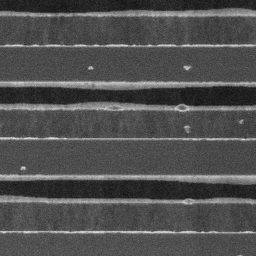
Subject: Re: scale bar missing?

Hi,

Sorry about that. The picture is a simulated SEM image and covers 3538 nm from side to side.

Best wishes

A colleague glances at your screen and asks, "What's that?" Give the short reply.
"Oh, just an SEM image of lines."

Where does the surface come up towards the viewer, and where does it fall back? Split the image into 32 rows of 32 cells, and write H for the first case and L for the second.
LLLLLLLLLLLLLLLLLLLLLLLLLLLLLLLL
LLLLLLLLLLLLLLLLLLLLLLLLLLLLLLLL
HHHHHHHHHHHHHHHHHHHHHHHHHHHHHHHH
HHHHHHHHHHHHHHHHHHHHHHHHHHHHHHHH
HHHHHHHHHHHHHHHHHHHHHHHHHHHHHHHH
HHHHHHHHHHHHHHHHHHHHHHHHHHHHHHHH
HHHHHHHHHHHHHHHHHHHHHHHHHHHHHHHH
HHHHHHHHHHHHHHHHHHHHHHHHHHHHHHHH
HHHHHHHHHHHHHHHHHHHHHHHHHHHHHHHH
HHHHHHHHHHHHHHHHHHHHHHHHHHHHHHHH
LLLLLLLLLLLLLHHHHHLLLLLLLLLLLLLL
LLLLLLLLLLLLLLLLLLLLLLLLLLLLLLLL
LLLLLLLLLLLLLLLLLLLLLLLLLLLLLLLL
LLLLLLLLLLLLLHHHLLLLLLHHLLLLLLLL
HHHHHHHHHHHHHHHHHHHHHHHHHHHHHHHH
HHHHHHHHHHHHHHHHHHHHHHHHHHHHHHHH
HHHHHHHHHHHHHHHHHHHHHHHHHHHHHHHH
HHHHHHHHHHHHHHHHHHHHHHHHHHHHHHHH
HHHHHHHHHHHHHHHHHHHHHHHHHHHHHHHH
HHHHHHHHHHHHHHHHHHHHHHHHHHHHHHHH
HHHHHHHHHHHHHHHHHHHHHHHHHHHHHHHH
HHHHHHHHHHHHHHHHHHHHHHHHHHHHHHHH
LLLLLLLLLLLLLLLLLLLLLLLLLLLLLLLL
LLLLLLLLLLLLLLLLLLLLLLLLLLLLLLLL
LLLLLLLLLLLLLLLLLLLLLLLLLLLLLLLL
HHHHHHHHHHHHHHHHHHHHHHHHHHHHHHHH
HHHHHHHHHHHHHHHHHHHHHHHHHHHHHHHH
HHHHHHHHHHHHHHHHHHHHHHHHHHHHHHHH
HHHHHHHHHHHHHHHHHHHHHHHHHHHHHHHH
HHHHHHHHHHHHHHHHHHHHHHHHHHHHHHHH
HHHHHHHHHHHHHHHHHHHHHHHHHHHHHHHH
HHHHHHHHHHHHHHHHHHHHHHHHHHHHHHHH